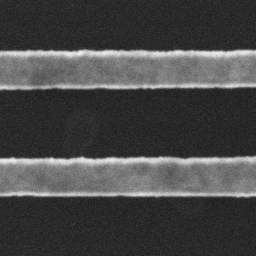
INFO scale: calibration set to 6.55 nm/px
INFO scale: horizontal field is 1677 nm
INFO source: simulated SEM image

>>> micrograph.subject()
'lines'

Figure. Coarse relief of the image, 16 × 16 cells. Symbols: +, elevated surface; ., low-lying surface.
................
................
................
++++++++++++++++
++++++++++++++++
++++++++++......
................
................
................
................
++++++++++++++++
++++++++++++++++
................
................
................
................